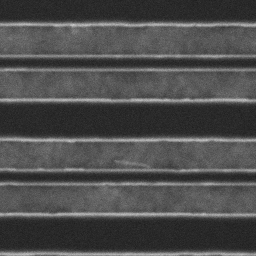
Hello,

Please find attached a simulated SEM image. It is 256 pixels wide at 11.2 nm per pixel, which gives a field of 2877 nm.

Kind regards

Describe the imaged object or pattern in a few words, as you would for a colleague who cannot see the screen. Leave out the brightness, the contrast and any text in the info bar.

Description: lines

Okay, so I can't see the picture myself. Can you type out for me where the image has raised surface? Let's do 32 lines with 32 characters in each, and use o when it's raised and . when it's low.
oooooooooooooooooooooooooooooooo
oooooooooooooooooooooooooooooooo
oooooooooooooooooooooooooooooooo
................................
................................
................................
................................
oooooooooooooooooooooooooooooooo
oooooooooooooooooooooooooooooooo
................................
................................
................................
oooooooooooo......o.......oo....
oooooooooooooooooooooooooooooooo
oooooooooooooooooooooooooooooooo
oooooooooooooooooooooooooooooooo
oooooooooooooooooooooooooooooooo
...oooooooooooooooo..oo....ooooo
................................
................................
................................
oooooooooooooooooooooooooooooooo
oooooooooooooooooooooooooooooooo
................................
................................
................................
................................
oooooooooooooooooooooooooooooooo
oooooooooooooooooooooooooooooooo
oooooooooooooooooooooooooooooooo
oooooooooooooooooooooooooooooooo
oooooooooooooooooooooooooooooooo